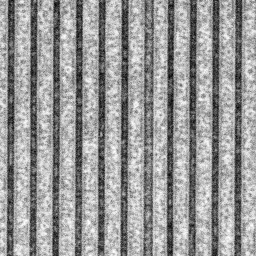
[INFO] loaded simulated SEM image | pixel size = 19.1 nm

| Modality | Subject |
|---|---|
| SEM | parallel lines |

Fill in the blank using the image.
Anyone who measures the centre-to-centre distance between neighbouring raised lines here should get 434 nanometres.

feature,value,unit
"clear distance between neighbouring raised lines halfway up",146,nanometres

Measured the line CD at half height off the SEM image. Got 289 nanometers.